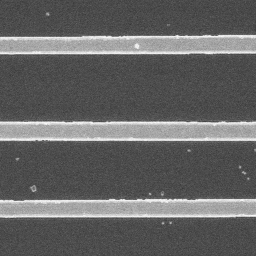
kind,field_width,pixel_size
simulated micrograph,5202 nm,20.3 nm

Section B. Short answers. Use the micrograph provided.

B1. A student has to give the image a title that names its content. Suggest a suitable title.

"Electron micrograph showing lines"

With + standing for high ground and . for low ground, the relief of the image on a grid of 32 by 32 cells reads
................................
................................
................................
................................
............................+...
++++++++++++++++++++++++++++++++
++++++++++++++++++++++++++++++++
................................
................................
................................
................................
................................
................................
................................
................................
++++++++++++++++++++++++++++++++
++++++++++++++++++++++++++++++++
...........+....................
................................
................................
................................
................................
................................
................................
................................
++++++++++++++++++++++++++++++++
++++++++++++++++++++++++++++++++
................................
................................
................................
................................
................................